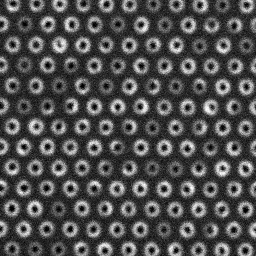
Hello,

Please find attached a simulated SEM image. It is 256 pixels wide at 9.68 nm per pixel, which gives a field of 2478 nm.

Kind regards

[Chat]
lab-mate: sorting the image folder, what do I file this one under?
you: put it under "a regular array of holes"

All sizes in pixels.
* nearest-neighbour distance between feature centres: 23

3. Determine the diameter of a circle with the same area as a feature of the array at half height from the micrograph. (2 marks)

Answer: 80.3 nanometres